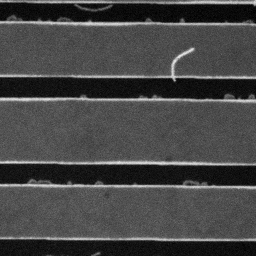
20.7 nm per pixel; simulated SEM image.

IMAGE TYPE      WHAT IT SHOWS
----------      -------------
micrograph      lines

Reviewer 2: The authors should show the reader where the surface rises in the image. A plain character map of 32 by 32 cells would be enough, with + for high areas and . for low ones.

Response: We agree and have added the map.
...............................+
................................
................................
++++++++++++++++++++++++++++++++
++++++++++++++++++++++++++++++++
++++++++++++++++++++++++++++++++
++++++++++++++++++++++++++++++++
++++++++++++++++++++++++++++++++
++++++++++++++++++++++++++++++++
++++++++++++++++++++++++++++++++
................................
................................
++++++++++++++++++++++++........
++++++++++++++++++++++++++++++++
++++++++++++++++++++++++++++++++
++++++++++++++++++++++++++++++++
++++++++++++++++++++++++++++++++
++++++++++++++++++++++++++++++++
++++++++++++++++++++++++++++++++
++++++++++++++++++++++++++++++++
........................++++++++
................................
................................
++++++++++++++++++++++++++++++++
++++++++++++++++++++++++++++++++
++++++++++++++++++++++++++++++++
++++++++++++++++++++++++++++++++
++++++++++++++++++++++++++++++++
++++++++++++++++++++++++++++++++
++++++++++++++++++++++++++++++++
................................
................................